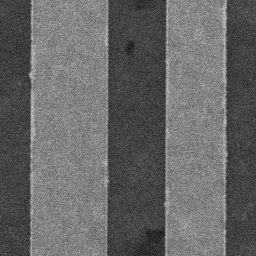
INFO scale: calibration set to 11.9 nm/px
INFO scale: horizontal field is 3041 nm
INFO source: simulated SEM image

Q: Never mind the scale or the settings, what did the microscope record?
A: one or a few lines or trenches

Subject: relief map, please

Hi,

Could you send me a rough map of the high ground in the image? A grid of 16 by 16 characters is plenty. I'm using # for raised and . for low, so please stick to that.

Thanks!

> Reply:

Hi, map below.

..#####...####..
..#####...####..
..#####...####..
..#####...####..
..#####...####..
..#####...####..
..#####...####..
..#####...####..
..#####...####..
..#####...####..
..#####...####..
..#####...####..
..#####...####..
..#####...####..
..#####...####..
..#####...####..